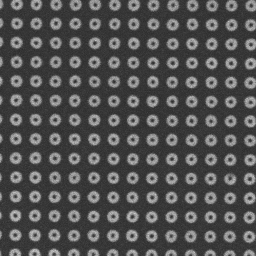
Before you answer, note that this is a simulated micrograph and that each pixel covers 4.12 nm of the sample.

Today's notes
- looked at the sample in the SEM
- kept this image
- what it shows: a regular array of ring-shaped raised bodies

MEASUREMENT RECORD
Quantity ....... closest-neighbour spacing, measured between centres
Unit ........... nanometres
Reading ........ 78.6